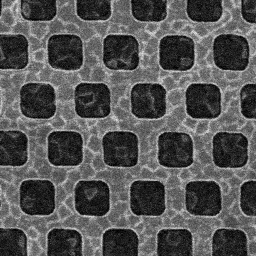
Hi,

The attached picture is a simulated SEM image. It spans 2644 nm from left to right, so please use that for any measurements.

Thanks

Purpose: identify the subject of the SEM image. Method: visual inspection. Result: a regular array of holes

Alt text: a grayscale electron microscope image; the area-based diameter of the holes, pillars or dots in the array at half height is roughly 39.3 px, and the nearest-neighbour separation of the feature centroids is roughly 54.9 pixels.